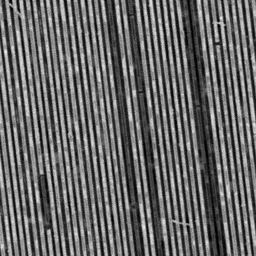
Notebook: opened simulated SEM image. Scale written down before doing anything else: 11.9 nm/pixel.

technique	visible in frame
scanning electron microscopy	parallel lines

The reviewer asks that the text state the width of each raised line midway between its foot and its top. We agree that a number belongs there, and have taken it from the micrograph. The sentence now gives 2.61 px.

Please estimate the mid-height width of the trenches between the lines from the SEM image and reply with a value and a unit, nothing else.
50.3 nanometers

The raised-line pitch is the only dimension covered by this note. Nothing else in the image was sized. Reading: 81 nm